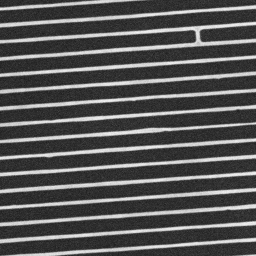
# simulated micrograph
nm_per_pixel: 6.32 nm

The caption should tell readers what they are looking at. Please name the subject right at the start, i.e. parallel lines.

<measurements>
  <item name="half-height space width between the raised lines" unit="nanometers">88.3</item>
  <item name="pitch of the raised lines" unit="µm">0.105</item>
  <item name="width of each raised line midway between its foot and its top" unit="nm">16.6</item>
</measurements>